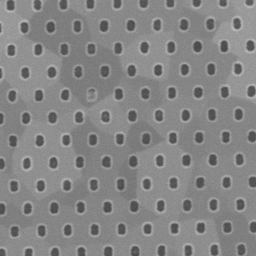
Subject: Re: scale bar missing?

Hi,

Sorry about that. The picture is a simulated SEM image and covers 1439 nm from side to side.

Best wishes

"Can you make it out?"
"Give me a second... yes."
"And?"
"a regular array of holes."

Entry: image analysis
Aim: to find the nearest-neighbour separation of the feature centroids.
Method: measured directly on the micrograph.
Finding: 26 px